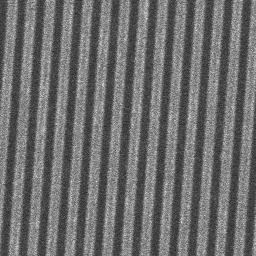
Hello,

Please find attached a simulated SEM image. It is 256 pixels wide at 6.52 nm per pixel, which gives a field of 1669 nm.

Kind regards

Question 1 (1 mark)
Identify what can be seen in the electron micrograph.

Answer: parallel lines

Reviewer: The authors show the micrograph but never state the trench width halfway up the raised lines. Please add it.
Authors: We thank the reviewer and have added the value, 0.0594 um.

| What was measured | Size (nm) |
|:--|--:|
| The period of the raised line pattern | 122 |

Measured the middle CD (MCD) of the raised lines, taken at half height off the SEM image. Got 59.4 nm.